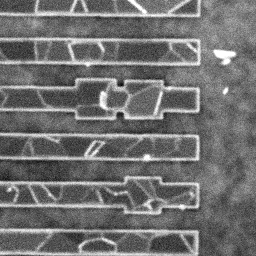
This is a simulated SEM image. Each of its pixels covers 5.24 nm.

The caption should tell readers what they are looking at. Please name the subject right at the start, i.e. wiring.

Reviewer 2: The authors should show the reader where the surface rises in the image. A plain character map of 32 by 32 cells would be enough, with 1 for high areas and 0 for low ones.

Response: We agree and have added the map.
11111111111111111111111110000000
11111111111111111111111110000000
00000000000000000000000000000000
00000000000000000000000000000000
00000000000000000000000000000000
11111111111111111111111110000000
11111111111111111111111110000000
11111111111111111111111110000000
00000000000000000000000000000000
00000000000000000000000000000000
00000000011111111111000000000000
11111111111111111111111110000000
11111111111111111111111110000000
11111111111111111111111110000000
00000000001111001111000000000000
00000000000000000000000000000000
00000000000000000000000000000000
11111111111111111111111110000000
11111111111111111111111110000000
11111111111111111111111110000000
00000000000000000000000000000000
00000000000000000000000000000000
00000000000000001111000000000000
11111111111111111111111110000000
11111111111111111111111110000000
11111111111111111111111110000000
00000000000000001111000000000000
00000000000000000000000000000000
00000000000000000000000000000000
11111111111111111111111110000000
11111111111111111111111110000000
11111111111111111111111110000000